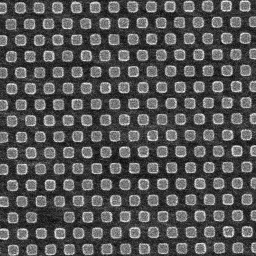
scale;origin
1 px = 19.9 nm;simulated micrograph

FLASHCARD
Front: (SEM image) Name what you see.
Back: a regular array of raised bodies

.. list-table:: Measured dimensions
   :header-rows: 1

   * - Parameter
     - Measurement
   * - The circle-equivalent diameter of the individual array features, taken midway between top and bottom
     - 219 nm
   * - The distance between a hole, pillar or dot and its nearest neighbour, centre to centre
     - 0.367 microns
